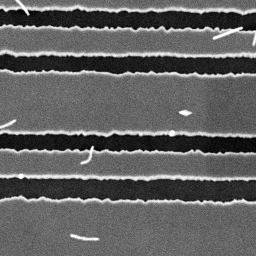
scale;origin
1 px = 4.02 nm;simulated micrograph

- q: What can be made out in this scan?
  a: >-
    lines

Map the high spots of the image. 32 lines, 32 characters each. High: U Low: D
UUUUUUUUUUUUUUUUUUUUUUUUUUUUUUUU
DDDDDDDDDDDDDDUDUUDDDDDUUUDDUUUU
DDDDDDDDDDDDDDDDDDDDDDDDDDDDDDDD
UUUUUUUUDUDUDDDDDDDDDDDDDDDDDDDD
UUUUUUUUUUUUUUUUUUUUUUUUUUUUUUUU
UUUUUUUUUUUUUUUUUUUUUUUUUUUUUUUU
UUUUUUUUUUUUUUUUUUUUUUUUUUUUUUUU
DDDDDDDDDDDDDDDDDDDDDDDDDDDDDDDD
DDDDDDDDDDDDDDDDDDDDDDDDDDDDDDDD
UUUUUUUUUUUUUUUUUUUUUUUUUUUUUUUU
UUUUUUUUUUUUUUUUUUUUUUUUUUUUUUUU
UUUUUUUUUUUUUUUUUUUUUUUUUUUUUUUU
UUUUUUUUUUUUUUUUUUUUUUUUUUUUUUUU
UUUUUUUUUUUUUUUUUUUUUUUUUUUUUUUU
UUUUUUUUUUUUUUUUUUUUUUUUUUUUUUUU
UUUUUUUUUUUUUUUUUUUUUUUUUUUUUUUU
UUUUUUUUUUUUUUUUUUUUUUUUUUUUUUUU
DDDDDDDDDDDDDDDDDDDDDDDDDDDDDDDD
DDDDDDDDDDDDDDDDDDDDDDDDDDDDDDDD
UUUUUUUUUUUUUUUUUUUUUUUUUUUUUUUU
UUUUUUUUUUUUUUUUUUUUUUUUUUUUUUUU
UUUUUUUUUUUUUUUUUUUUUUUUUUUUUUUU
DDDDDDDDDDDDDDDDDDDDDDDDDDUUUDUD
DDDDDDDDDDDDDDDDDDDDDDDDDDDDDDDD
DDDDDDDDDDDDDDDDDDDDDDDDDDDDDDDD
UUUUUUUUUUUUUUUUUUUUUUUUUUUUUUUU
UUUUUUUUUUUUUUUUUUUUUUUUUUUUUUUU
UUUUUUUUUUUUUUUUUUUUUUUUUUUUUUUU
UUUUUUUUUUUUUUUUUUUUUUUUUUUUUUUU
UUUUUUUUUUUUUUUUUUUUUUUUUUUUUUUU
UUUUUUUUUUUUUUUUUUUUUUUUUUUUUUUU
UUUUUUUUUUUUUUUUUUUUUUUUUUUUUUUU